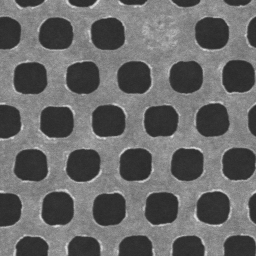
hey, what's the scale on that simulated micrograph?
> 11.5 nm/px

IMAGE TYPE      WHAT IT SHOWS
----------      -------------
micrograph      a regular array of holes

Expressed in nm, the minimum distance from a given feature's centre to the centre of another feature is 580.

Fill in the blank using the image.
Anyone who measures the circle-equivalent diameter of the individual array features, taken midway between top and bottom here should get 0.396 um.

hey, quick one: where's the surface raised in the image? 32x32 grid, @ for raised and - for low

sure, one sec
@@---@@@@---@@@---@@@@---@@@@--@
@@@@@@@@@@@@@@@@@@@@@@@@@@@@@@@@
--@@@@--@@@@---@@@@@@@@@@---@@@-
---@@----@@-----@@@@@@@@-----@@-
---@@----@@-----@@@@@@@@-----@@-
--@@@----@@@---@@@@@@@@@@---@@@-
@@@@@@@@@@@@@@@@@@@@@@@@@@@@@@@@
@@@@@@@@@@@@@@@@@@@@@@@@@@@@@-@@
@@----@@@---@@@----@@----@@@----
@@----@@----@@@----@@----@@@----
@@----@@----@@@----@@----@@@----
@@---@@@@---@@@---@@@@--@@@@@--@
@@@@@@@@@@@@@@@@@@@@@@@@@@@@@@@@
--@@@@---@@@---@@@@---@@@---@@@-
---@@----@@-----@@----@@@----@@-
---@@----@@@----@@----@@-----@@-
--@@@----@@@---@@@----@@@---@@@-
@@@@@@@@@@@@@@@@@@@@@@@@@@@@@@@@
@@@@@@@@@@@@@@@@@@@@@@@@@@@@@--@
@@----@@@---@@@----@@@---@@@----
@@----@@-----@@----@@----@@@----
@@----@@----@@@----@@----@@@----
@@@--@@@@--@@@@@--@@@@--@@@@@-@@
@@@@@@@@@@@@@@@@@@@@@@@@@@@@@@@@
--@@@@---@@@---@@@@---@@@---@@@@
---@@----@@@----@@----@@@----@@-
---@@----@@@----@@----@@@----@@-
--@@@----@@@---@@@----@@@---@@@-
@@@@@@@@@@@@@@@@@@@@@@@@@@@@@@@@
@@@@@@@@@@-@@@@@--@@@@@-@@@@@--@
@@----@@@---@@@----@@@---@@@----
@@----@@-----@@----@@-----@@----